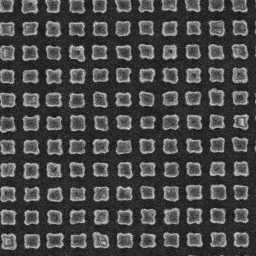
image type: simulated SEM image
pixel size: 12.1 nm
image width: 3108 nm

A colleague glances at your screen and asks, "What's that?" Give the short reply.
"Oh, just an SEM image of a regular array of raised bodies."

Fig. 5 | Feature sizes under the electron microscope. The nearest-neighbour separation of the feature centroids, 276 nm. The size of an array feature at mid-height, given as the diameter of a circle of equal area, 179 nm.